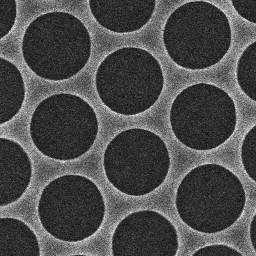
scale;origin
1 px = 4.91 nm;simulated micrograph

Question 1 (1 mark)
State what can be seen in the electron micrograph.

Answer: a regular array of holes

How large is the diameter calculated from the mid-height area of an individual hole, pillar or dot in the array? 330 nanometers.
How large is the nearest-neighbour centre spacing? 0.394 micrometres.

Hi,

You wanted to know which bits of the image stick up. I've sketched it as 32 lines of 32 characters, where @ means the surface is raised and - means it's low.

--@@@@@@@@@--------@@@@---@@@---
--@@@@@-@@@--------@@@------@@--
--@@------@@-------@@-------@@@-
-@@--------@@-----@@@--------@@@
-@@--------@@@@@@@@@---------@@@
@@@--------@@@@@@@@@@--------@@-
@@@--------@@@----@@@-------@@--
-@@--------@@-------@@------@@--
--@@------@@--------@@@---@@@@--
---@@----@@@--------@@@@@@@@@@--
---@@@@@@@@@--------@@@@@-@@@@--
---@@@@@@@@@--------@@@-----@@@-
---@@-----@@@-------@@-------@@@
---@@------@@@-----@@--------@@@
--@@--------@@@@@@@@@---------@@
@@@@--------@@@@@@@@@--------@@@
@@@@--------@@@----@@@-------@@-
-@@@--------@@------@@------@@--
---@@------@@--------@@@---@@@--
---@@@----@@@--------@@@@@@@@@--
----@@@@@@@@@--------@@@@@-@@@--
----@@@@@@@@@--------@@@-----@@-
----@@@----@@@------@@@-------@@
---@@@------@@@-----@@--------@@
---@@--------@@@@@@@@@---------@
-@@@@--------@@@@@@@@@---------@
@@@@@--------@@@@--@@@--------@@
--@@@--------@@------@@-------@@
----@@------@@@-------@@----@@@-
----@@@----@@@--------@@@@@@@@@-
-----@@@@@@@@@--------@@@@@@@@@@
-----@@@@@@@@@--------@@------@@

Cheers